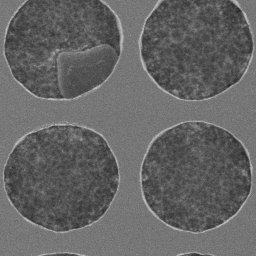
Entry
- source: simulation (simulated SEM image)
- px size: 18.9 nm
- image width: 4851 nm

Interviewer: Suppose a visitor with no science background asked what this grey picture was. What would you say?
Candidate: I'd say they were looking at holes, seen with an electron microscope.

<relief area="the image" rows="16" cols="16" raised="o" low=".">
o......ooo.....o
o......oo......o
........o.......
.......oo.......
o......oo......o
oo....oooo....oo
oooooooooooooooo
oooooooooooooooo
oo....oooo.....o
o......oo......o
.......oo.......
.......oo.......
o......oo......o
o.....oooo.....o
oooooooooooo.ooo
oooooooooooooooo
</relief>